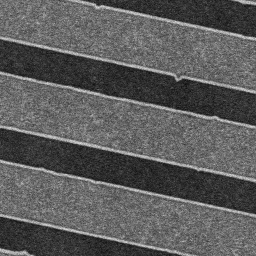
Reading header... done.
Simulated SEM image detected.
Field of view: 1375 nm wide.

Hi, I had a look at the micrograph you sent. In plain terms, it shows one or a few lines or trenches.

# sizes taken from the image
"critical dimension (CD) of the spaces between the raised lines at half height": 186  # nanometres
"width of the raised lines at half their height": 279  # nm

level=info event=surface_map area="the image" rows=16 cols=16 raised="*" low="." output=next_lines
*******.........
************....
.***************
.....***********
..........******
****...........*
*********.......
**************..
...*************
........********
**..........****
*******.........
***********.....
****************
.....***********
..........******